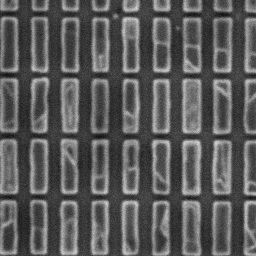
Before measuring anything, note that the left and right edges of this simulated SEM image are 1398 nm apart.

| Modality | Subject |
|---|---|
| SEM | wiring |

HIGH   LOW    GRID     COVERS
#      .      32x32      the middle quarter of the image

###.....###....####....###....##
###.....###....###.....###....##
................................
................................
###....####....###.....##.....##
###....####....###.....###....##
###....####....###.....###....##
###....####....###.....###....##
###....####....###.....###....##
###....####....###.....###....##
###....####....###.....###....##
###....####....###.....###....##
###....####....###.....###....##
###....####....###.....###....##
###....####....###.....###....##
.##....####....###.....###....##
.......####....###.....###....##
................................
................................
###....####....###....####....##
###....####....####...####....##
###....####....####...####....##
###....####....###....####....##
###....####....###....####....##
###....####....###....####....##
###....####....###....####....##
###....####....###....####....##
###....####....###....####....##
###....####....###....####....##
###....####....###....####....##
###....####....###....####....##
###....####....###....####....##